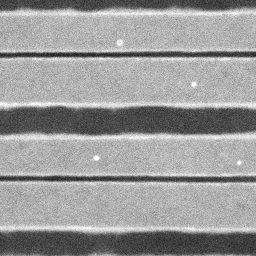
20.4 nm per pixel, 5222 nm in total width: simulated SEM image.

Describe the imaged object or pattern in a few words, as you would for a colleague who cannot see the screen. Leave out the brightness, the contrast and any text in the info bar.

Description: lines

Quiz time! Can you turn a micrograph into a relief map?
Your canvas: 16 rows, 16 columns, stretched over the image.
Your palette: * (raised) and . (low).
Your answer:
................
****************
****************
****************
****************
****************
****************
................
................
****************
****************
****************
****************
****************
................
................